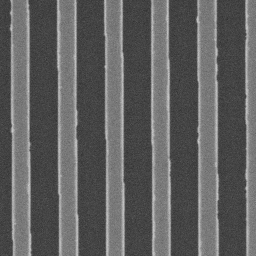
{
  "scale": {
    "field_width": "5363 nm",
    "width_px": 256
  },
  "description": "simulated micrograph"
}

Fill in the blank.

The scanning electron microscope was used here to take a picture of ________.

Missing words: lines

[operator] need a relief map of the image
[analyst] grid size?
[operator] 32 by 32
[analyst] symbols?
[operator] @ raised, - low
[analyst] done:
-@@----@@----@@----@@----@@----@
-@@----@@----@@----@@----@@----@
-@@@---@@----@@----@@----@@----@
-@@@---@@----@@----@@----@@----@
-@@@---@@----@@----@@----@@----@
-@@@---@@----@@----@@----@@----@
-@@@---@@----@@----@@----@@----@
-@@@---@@----@@----@@----@@----@
-@@@---@@----@@----@@----@@----@
-@@@---@@----@@----@@----@@----@
-@@@---@@----@@----@@----@@----@
-@@@---@@----@@----@@----@@----@
-@@@---@@----@@----@@----@@----@
-@@@---@@----@@----@@----@@----@
-@@@---@@----@@----@@----@@----@
-@@@---@@----@@----@@----@@----@
--@@---@@----@@----@@----@@----@
--@@---@@----@@----@@----@@----@
--@@---@@----@@----@@----@@----@
--@@---@@@---@@----@@----@@----@
--@@---@@@---@@----@@----@@----@
--@@---@@@---@@----@@----@@----@
--@@---@@@---@@----@@----@@----@
--@@---@@@---@@----@@----@@----@
--@@---@@@---@@----@@----@@----@
--@@---@@@---@@----@@----@@----@
--@@---@@@---@@----@@----@@----@
--@@---@@@---@@----@@----@@----@
--@@---@@@---@@----@@----@@----@
--@@---@@@---@@----@@----@@----@
--@@---@@@---@@----@@----@@----@
--@@---@@@---@@----@@----@@----@